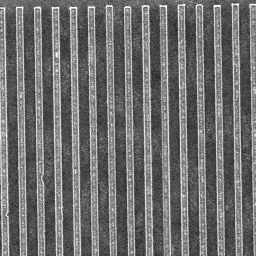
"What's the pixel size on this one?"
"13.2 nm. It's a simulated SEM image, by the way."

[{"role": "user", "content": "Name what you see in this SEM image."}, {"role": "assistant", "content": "parallel lines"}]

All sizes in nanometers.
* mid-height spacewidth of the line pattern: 148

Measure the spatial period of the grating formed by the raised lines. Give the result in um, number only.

0.237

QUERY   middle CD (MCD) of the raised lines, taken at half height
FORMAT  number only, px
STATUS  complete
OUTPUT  6.12